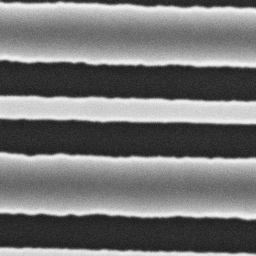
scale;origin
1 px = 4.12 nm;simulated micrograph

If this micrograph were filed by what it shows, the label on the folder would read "lines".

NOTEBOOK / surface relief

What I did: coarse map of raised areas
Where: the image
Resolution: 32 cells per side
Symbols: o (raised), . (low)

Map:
ooo..oooooo.....................
oooooooooooooooooooooooooooooooo
oooooooooooooooooooooooooooooooo
oooooooooooooooooooooooooooooooo
oooooooooooooooooooooooooooooooo
oooooooooooooooooooooooooooooooo
oooooooooooooooooooooooooooooooo
.ooooooooooooooooooooooooooooooo
................................
................................
................................
................................
ooooooooooooooooooooo...........
oooooooooooooooooooooooooooooooo
oooooooooooooooooooooooooooooooo
................................
................................
................................
................................
ooo.ooooo.......................
oooooooooooooooooooooooooooooooo
oooooooooooooooooooooooooooooooo
oooooooooooooooooooooooooooooooo
oooooooooooooooooooooooooooooooo
oooooooooooooooooooooooooooooooo
oooooooooooooooooooooooooooooooo
oooooooooooooooooooooooooooooooo
................................
................................
................................
................................
ooooooooooooooo.oo..............